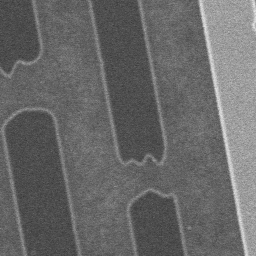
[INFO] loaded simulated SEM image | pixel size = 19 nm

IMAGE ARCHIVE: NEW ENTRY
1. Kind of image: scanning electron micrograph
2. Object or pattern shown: one or a few lines or trenches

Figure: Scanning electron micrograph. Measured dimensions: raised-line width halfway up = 926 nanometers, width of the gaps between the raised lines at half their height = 1130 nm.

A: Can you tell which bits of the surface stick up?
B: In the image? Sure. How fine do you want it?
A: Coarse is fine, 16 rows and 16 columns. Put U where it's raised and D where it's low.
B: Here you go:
UUDDDDUUUDDDDUUU
UUDDDDUUUDDDDUUU
UUUDDDUUUDDDDUUU
UUDDDDUUUDDDDUUU
DDDDDDUUUUDDDUUU
DDDDDDDUUUDDDDUU
DDDDDDDUUUDDDDUU
DUUDDDDUUUDDDDUU
UUUUDDDUUUDDDDUU
UUUUDDDUUUDDDDUU
DUUUDDDDDDDDDDUU
DUUUDDDDDDDDDDDU
DUUUDDDDUUUDDDDU
DUUUUDDDUUUDDDDU
DUUUUDDDUUUDDDDU
DDUUUDDDUUUUDDDU